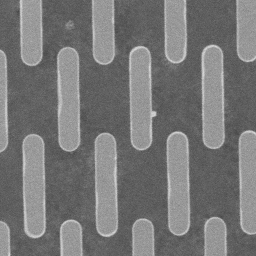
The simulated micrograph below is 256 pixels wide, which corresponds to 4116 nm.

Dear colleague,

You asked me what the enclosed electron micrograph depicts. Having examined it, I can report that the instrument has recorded groups of lines, slits or small figures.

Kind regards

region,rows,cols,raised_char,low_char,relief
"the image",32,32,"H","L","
LLLHHLLLLLLLHHLLLLLLLHHLLLLLLLHH
LLLHHLLLLLLLHHLLLLLLLHHLLLLLLLHH
LLLHHLLLLLLLHHLLLLLLLHHLLLLLLLHH
LLLHHLLLLLLLHHLLLLLLLHHLLLLLLLHH
LLLHHLLLLLLLHHLLLLLLLHHLLLLLLLHH
LLLHHLLLLLLLHHLLLLLLLHHLLLLLLLHH
LLLHHLLHHHLLHHLLHHHLLHHLLHHHLLHH
HLLHHLLHHHLLHHLLHHHLLHHLLHHHLLHH
HLLLLLLHHHLLLLLLHHHLLLLLLHHHLLLL
HLLLLLLHHHLLLLLLHHHLLLLLLHHHLLLL
HLLLLLLHHHLLLLLLHHHLLLLLLHHHLLLL
HLLLLLLHHHLLLLLLHHHLLLLLLHHHLLLL
HLLLLLLLHHLLLLLLHHHLLLLLLHHHLLLL
HLLLLLLHHHLLLLLLHHHLLLLLLHHHLLLL
HLLLLLLHHHLLLLLLHHHLLLLLLHHHLLLL
HLLLLLLHHHLLLLLLHHHLLLLLLHHHLLLL
HLLLLLLHHHLLLLLLHHHLLLLLLHHHLLLH
HLLHHLLHHHLLHHLLHHHLLHHLLHHHLLHH
HLLHHLLLHHLLHHLLLHLLLHHLLLHLLLHH
LLLHHLLLLLLLHHLLLLLLLHHLLLLLLLHH
LLLHHLLLLLLLHHLLLLLLLHHHLLLLLLHH
LLLHHLLLLLLLHHLLLLLLLHHLLLLLLLHH
LLLHHLLLLLLLHHLLLLLLLHHHLLLLLLHH
LLLHHLLLLLLLHHLLLLLLLHHHLLLLLLHH
LLLHHHLLLLLLHHLLLLLLLHHHLLLLLLHH
LLLHHLLLLLLLHHHLLLLLLHHHLLLLLLHH
LLLHHHLLLLLLHHHLLLLLLHHHLLLLLLHH
LLLHHHLLLLLLHHHLLHLLLHHHLLHHLLHH
HLLHHHLLHHLLHHHLLHHLLHHHLLHHLLHH
HLLLHLLLHHLLLLLLLHHLLLLLLLHHLLLL
HLLLLLLLHHLLLLLLLHHLLLLLLLHHLLLL
HLLLLLLLHHLLLLLLLHHLLLLLLLHHLLLL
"